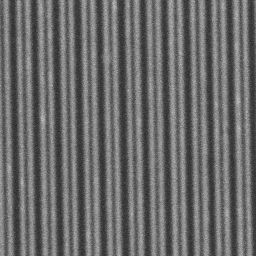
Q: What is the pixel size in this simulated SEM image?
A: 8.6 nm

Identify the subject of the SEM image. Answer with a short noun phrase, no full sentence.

parallel lines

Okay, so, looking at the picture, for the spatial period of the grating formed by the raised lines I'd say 0.0934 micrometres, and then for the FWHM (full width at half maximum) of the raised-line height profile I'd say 0.0451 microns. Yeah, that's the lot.